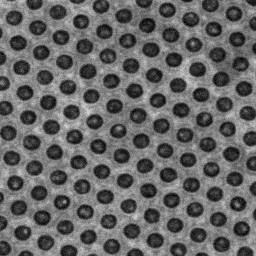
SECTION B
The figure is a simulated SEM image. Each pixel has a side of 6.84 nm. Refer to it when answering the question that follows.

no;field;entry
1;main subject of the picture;a regular array of holes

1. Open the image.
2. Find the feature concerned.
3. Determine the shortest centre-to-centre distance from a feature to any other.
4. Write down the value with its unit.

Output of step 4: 170 nm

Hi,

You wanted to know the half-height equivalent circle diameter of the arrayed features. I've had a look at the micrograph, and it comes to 120 nanometres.